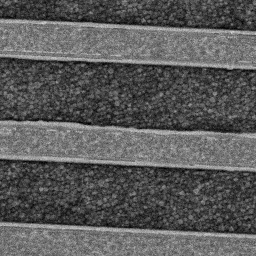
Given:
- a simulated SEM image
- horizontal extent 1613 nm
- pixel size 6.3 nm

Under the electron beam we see one or a few lines or trenches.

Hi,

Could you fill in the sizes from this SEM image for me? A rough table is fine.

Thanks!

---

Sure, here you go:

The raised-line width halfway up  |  218 nm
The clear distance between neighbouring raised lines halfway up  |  424 nanometers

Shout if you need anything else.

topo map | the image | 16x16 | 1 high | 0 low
0000000000000000
1111000000000000
1111111111111111
0111111111111111
0000000000000000
0000000000000000
0000000000000000
0000000000000000
1111111111111111
1111111111111111
0000000000000011
0000000000000000
0000000000000000
0000000000000000
1111111111000000
1111111111111111